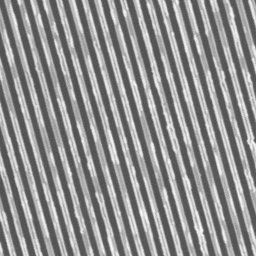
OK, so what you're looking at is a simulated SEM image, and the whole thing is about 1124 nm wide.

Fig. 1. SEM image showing parallel lines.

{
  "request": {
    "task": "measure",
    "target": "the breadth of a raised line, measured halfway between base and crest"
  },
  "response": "25.9 nm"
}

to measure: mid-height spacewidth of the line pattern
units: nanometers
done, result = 30.1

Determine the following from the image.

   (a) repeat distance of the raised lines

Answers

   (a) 54.3 nm